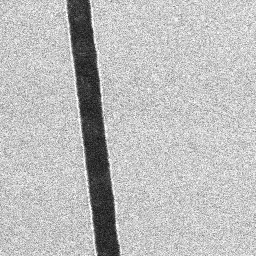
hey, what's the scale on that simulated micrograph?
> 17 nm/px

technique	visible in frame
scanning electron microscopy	one or a few lines or trenches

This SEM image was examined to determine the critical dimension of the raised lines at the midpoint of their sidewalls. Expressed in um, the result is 0.447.